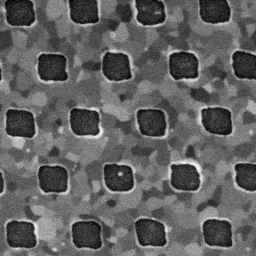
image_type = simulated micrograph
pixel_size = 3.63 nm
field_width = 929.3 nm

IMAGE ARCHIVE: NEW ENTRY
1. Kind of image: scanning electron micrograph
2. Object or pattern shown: a regular array of holes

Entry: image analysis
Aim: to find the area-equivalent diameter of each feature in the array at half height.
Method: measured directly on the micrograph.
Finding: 113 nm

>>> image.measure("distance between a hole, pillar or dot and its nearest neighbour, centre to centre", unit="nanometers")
232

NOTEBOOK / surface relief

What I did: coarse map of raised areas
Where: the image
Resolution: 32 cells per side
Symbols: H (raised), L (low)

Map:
HLLLHHHHHLLLHHHHHLLLLHHHHLLLLHHH
HLLLHHHHHLLLHHHHHLLLLHHHHLLLLHHH
HLLLHHHHHLLLHHHHHLLLLHHHHLLLLHHH
HHHHHHHHHHHHHHHHHHHHHHHHHHHHHHHH
HHHHHHHHHHHHHHHHHHHHHHHHHHHHHHHH
HHHHHHHHHHHHHHHHHHHHHHHHHHHHHHHH
HHHHHHHHHHHHHLLHHHHHHHLHHHHHHLLH
HHHHHLLLHHHHHLLLHHHHHLLLLHHHHLLL
HHHHHLLLHHHHHLLLHHHHHLLLLHHHHLLL
HHHHHLLLHHHHHLLLHHHHHLLLLHHHHHLL
HHHHHHHHHHHHHHHHHHHHHHHHHHHHHHHH
HHHHHHHHHHHHHHHHHHHHHHHHHHHHHHHH
HHHHHHHHHHHHHHHHHHHHHHHHHHHHHHHH
HHHHHHHHHLHHHHHHHHHHHHHHHHLLHHHH
HLLLHHHHHLLLHHHHHLLLLHHHHLLLLHHH
HLLLHHHHHLLLLHHHHLLLLHHHHLLLLHHH
HLLLHHHHHLLLLHHHHHLLLHHHHHLLLHHH
HHHHHHHHHHHHHHHHHHHHHHHHHHHHHHHH
HHHHHHHHHHHHHHHHHHHHHHHHHHHHHHHH
HHHHHHHHHHHHHHHHHHHHHHHHHHHHHHHH
HHHHHHHHHHHHHHLHHHHHHHLLHHHHHHLL
HHHHHLLLHHHHHLLLLHHHHLLLLHHHHLLL
HHHHHLLLLHHHHLLLLHHHHLLLLHHHHLLL
LHHHHLLLHHHHHLLLLHHHHHLLLHHHHHLL
HHHHHHHHHHHHHHHHHHHHHHHHHHHHHHHH
HHHHHHHHHHHHHHHHHHHHHHHHHHHHHHHH
HHHHHHHHHHHHHHHHHHHHHHHHHHHHHHHH
HHHHHHHHHHHHHHHHHLLHHHHHHHLLHHHH
HLLLHHHHHLLLLHHHHLLLLHHHHLLLLHHH
HLLLLHHHHLLLLHHHHLLLLHHHHLLLLHHH
HLLLLHHHHLLLLHHHHLLLLHHHHHLLLHHH
HHHHHHHHHHHHHHHHHHHHHHHHHHHHHHHH